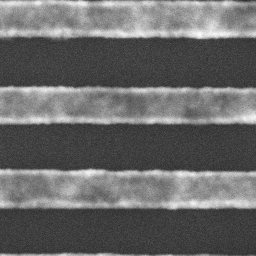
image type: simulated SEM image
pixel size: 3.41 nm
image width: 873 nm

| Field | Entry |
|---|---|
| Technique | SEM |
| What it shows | lines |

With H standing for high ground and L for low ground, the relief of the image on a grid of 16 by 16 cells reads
HHHHHHHHHHHHHHHH
HHHHHHHHHHHHHHHH
LLLLLLLLLLLLLLLL
LLLLLLLLLLLLLLLL
LLLLLLLLLLLLLLLL
HHHHHHHLLHLHLHLL
HHHHHHHHHHHHHHHH
HHHHHHHHHHHHHHHH
LLLLLLLLLLLLLLLL
LLLLLLLLLLLLLLLL
LLLLLLLLLLLLLLLL
HHHHHHHHHHHHHHHH
HHHHHHHHHHHHHHHH
LLLLLLLLLLLLLLLL
LLLLLLLLLLLLLLLL
LLLLLLLLLLLLLLLL